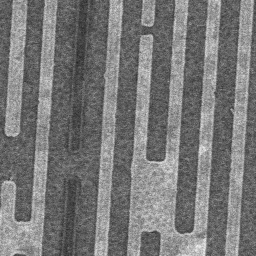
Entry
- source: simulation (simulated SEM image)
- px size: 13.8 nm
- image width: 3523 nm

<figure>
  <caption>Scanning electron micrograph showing parallel lines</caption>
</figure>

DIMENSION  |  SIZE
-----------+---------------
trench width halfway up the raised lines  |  21.6 px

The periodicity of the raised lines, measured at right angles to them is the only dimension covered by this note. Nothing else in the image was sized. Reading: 446 nm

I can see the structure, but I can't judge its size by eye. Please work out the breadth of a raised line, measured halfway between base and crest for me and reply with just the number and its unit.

154 nanometers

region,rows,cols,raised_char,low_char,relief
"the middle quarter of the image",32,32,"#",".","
...##......##......##......###..
...##......##......##......###..
...##.....###......##......###..
..###.....###......##......##...
..###......##......##......##...
..###......##......##......###..
..###.....###......##......##...
..###.....###......##......##...
..###.....###......##......##...
..###.....###.....###......##...
..###.....###.....###......##...
..###.....###.....###......##...
..##......##......###......##...
..##......###.....###.....###...
..##......###.....###.....###...
..##......###.....###.....###...
..##......##......##......###...
..##......##......##......###...
..##......##......##......###...
.###......##......##......##....
.###......##......##......##....
.###......##......##......##....
.........###......##......##....
.........###.....###......##....
.........###.....####....###....
.........###.....###########....
.........###.....###########....
....#....###.....###########....
.##.#....###.....###########....
.##......###.....###########....
.##......###.....###########..#.
.##......###.....###########....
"